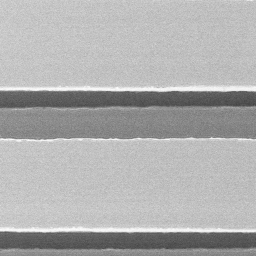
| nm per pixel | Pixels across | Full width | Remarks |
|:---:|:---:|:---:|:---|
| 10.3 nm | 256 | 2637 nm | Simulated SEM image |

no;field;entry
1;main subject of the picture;lines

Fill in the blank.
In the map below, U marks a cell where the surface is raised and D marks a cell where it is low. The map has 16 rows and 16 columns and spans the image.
UUUUUUUUUUUUUUUU
UUUUUUUUUUUUUUUU
UUUUUUUUUUUUUUUU
UUUUUUUUUUUUUUUU
UUUUUUUUUUUUUUUU
UUUUUUUUUUUUUUUU
DDDDDDDDDDDDDDDD
DDDDDDDDDDDDDDDD
DDDDDDDDDDDDDDDD
UUUUUUUUUUUUUUUU
UUUUUUUUUUUUUUUU
UUUUUUUUUUUUUUUU
UUUUUUUUUUUUUUUU
UUUUUUUUUUUUUUUU
DDDDDDDDDDDDDDDD
DDDDDDDDDDDDDDDD